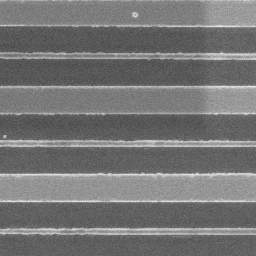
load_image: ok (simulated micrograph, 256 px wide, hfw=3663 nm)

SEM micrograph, lines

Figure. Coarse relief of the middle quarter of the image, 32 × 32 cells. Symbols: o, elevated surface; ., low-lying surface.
................................
................................
................................
................................
................................
................................
oooooooooooooooooooooooooooooooo
oooooooooooooooooooooooooooooooo
oooooooooooooooooooooooooooooooo
oooooooooooooooooooooooooooooooo
oooooooooooooooooooooooooooooooo
oooooooooooooooooooooooooooooooo
.......o........................
................................
................................
................................
................................
................................
................................
oooooooooooooooooooooooooooooooo
oooooooooooooooooooooooooooooooo
................................
................................
................................
................................
................................
................................
................................
oooooooooooooooooooooooooooooooo
oooooooooooooooooooooooooooooooo
oooooooooooooooooooooooooooooooo
oooooooooooooooooooooooooooooooo